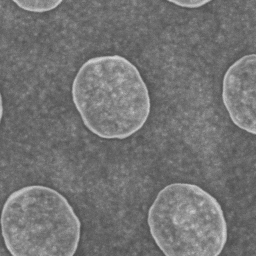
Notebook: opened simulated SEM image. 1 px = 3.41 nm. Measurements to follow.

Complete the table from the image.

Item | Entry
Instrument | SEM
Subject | raised bodies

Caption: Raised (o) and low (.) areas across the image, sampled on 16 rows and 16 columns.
.oo.............
................
................
................
.....oooo.....oo
.....oooo.....oo
.....oooo.....oo
.....oooo......o
......oo........
................
................
...........o....
.ooo......ooo...
ooooo....ooooo..
ooooo....ooooo..
.oooo.....oooo..